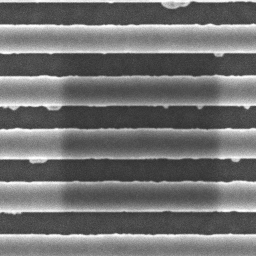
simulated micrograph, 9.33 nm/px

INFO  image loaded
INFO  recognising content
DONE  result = lines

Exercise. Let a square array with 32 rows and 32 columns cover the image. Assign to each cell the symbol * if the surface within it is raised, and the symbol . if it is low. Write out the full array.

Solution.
................................
................................
................................
********************************
********************************
********************************
********************************
................................
................................
...........................*....
********************************
********************************
********************************
................................
................................
................................
********************************
********************************
********************************
********************************
................................
................................
................................
********************************
********************************
********************************
................................
................................
................................
********************************
********************************
********************************